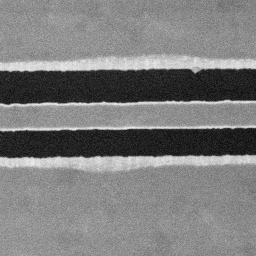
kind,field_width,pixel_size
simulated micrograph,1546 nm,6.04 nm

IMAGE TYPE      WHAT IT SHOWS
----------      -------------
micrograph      lines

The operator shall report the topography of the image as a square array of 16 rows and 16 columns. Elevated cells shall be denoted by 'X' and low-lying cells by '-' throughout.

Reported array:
XXXXXXXXXXXXXXXX
XXXXXXXXXXXXXXXX
XXXXXXXXXXXXXXXX
XXXXXXXXXXXXXXXX
----------------
----------------
--XXXXXXXXXXXXXX
XXXXXXXXXXXXXXXX
----------------
----------------
XXXXXXXXXXXXXXXX
XXXXXXXXXXXXXXXX
XXXXXXXXXXXXXXXX
XXXXXXXXXXXXXXXX
XXXXXXXXXXXXXXXX
XXXXXXXXXXXXXXXX